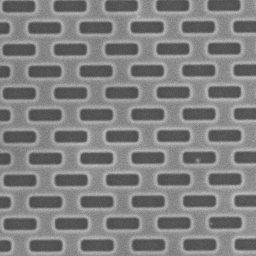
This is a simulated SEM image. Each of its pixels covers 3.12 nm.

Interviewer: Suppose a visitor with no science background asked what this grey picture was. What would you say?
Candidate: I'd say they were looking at groups of lines, slits or small figures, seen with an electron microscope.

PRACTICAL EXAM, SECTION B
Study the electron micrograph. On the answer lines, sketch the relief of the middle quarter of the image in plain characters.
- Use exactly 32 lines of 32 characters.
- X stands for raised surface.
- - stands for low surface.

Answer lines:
XXXX--------XXXXX--------XXXXX--
XXXX--------XXXX---------XXXX---
XXXX--------XXXXX--------XXXX---
XXXXXXXXXXXXXXXXXXXXXXXXXXXXXXXX
XXXXXXXXXXXXXXXXXXXXXXXXXXXXXXXX
XXXXXXXXXXXX------XXXXXX-------X
------XXXX---------XXXX---------
------XXXX---------XXXX---------
------XXXX--------XXXXX--------X
XXXXXXXXXXXXXXXXXXXXXXXXXXXXXXXX
XXXXXXXXXXXXXXXXXXXXXXXXXXXXXXXX
XXXX--------XXXXX--------XXXXX--
XXXX--------XXXX---------XXXX---
XXXX--------XXXXX--------XXXXX--
XXXXXXXXXXXXXXXXXXXXXXXXXXXXXXXX
XXXXXXXXXXXXXXXXXXXXXXXXXXXXXXXX
XX---XXXXXX-------XXXXXX-------X
------XXXX---------XXXX---------
------XXXX---------XXXX---------
------XXXXX-------XXXXXX-------X
XXXXXXXXXXXXXXXXXXXXXXXXXXXXXXXX
XXXXXXXXXXXXXXXXXXXXXXXXXXXXXXXX
XXXX--------XXXXX--------XXXXX--
XXXX--------XXXXX--------XXXX---
XXXX--------XXXXX--------XXXXX--
XXXXXXXXXXXXXXXXXXXXXXXXXXXXXXXX
XXXXXXXXXXXXXXXXXXXXXXXXXXXXXXXX
-----XXXXXX-------XXXXXX-------X
------XXXX---------XXXX---------
------XXXX---------XXXX---------
-----XXXXXX-------XXXXXX------XX
XXXXXXXXXXXXXXXXXXXXXXXXXXXXXXXX